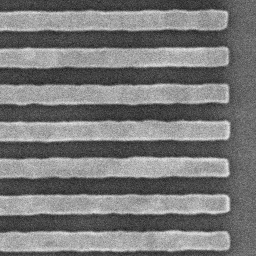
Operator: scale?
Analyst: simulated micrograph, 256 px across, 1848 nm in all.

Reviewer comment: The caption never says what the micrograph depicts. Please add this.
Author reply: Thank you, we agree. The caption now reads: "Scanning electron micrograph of wiring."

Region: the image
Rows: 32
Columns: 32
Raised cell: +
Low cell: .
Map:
................................
..........++.....+++++++++++....
++++++++++++++++++++++++++++....
++++++++++++++++++++++++++++....
................................
................................
++++++++++++++++++++++++++++....
++++++++++++++++++++++++++++....
................................
................................
................................
++++++++++++++++++++++++++++....
++++++++++++++++++++++++++++....
................................
................................
++++++++++++++++++++++++++++....
+++++++++++++++++++++++++++++...
+++++++++.......................
................................
................................
++++++++++++++++++++++++++++....
+++++++++++++++++++++++++++++...
................................
................................
..........+....++..+...+++.+....
+++++++++++++++++++++++++++++...
++++++++++++++++++++++++++++....
................................
................................
++++++++++++++++++++++++++++....
+++++++++++++++++++++++++++++...
................................